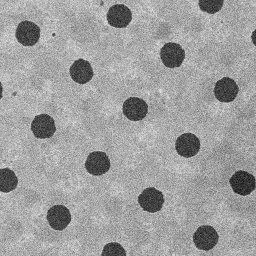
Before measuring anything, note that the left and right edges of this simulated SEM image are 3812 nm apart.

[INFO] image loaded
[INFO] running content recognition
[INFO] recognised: a regular array of holes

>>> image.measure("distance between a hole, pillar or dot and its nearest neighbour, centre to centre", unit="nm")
971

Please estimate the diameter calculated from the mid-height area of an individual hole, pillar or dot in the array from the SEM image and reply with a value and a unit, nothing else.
386 nm